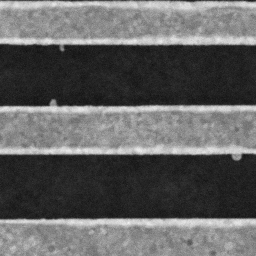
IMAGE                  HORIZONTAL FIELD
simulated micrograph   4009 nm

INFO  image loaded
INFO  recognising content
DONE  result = lines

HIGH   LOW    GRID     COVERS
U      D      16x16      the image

UUUUUUUUUUUUUUUU
UUUUUUUUUUUUUUUU
UUUUUUUUUUUUUUUU
DDDDDDDDDDDDDDDD
DDDDDDDDDDDDDDDD
DDDDDDDDDDDDDDDD
DDDDDDDDDDDDDDDD
UUUUUUUUUUUUUUUU
UUUUUUUUUUUUUUUU
UUUUUUUUUUUUUUUU
DDDDDDDDDDDDDDDD
DDDDDDDDDDDDDDDD
DDDDDDDDDDDDDDDD
DDDDDDDDDDDDDDDD
UUUUUUUUUUUUUUUU
UUUUUUUUUUUUUUUU